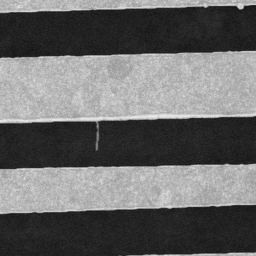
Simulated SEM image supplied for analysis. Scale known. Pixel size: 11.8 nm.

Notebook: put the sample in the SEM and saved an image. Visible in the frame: lines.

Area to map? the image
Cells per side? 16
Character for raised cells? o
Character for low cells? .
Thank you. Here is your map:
oooooooo........
................
................
.......ooooooooo
oooooooooooooooo
oooooooooooooooo
oooooooooooooooo
ooooo...........
................
................
.....ooooooooooo
oooooooooooooooo
oooooooooooooooo
................
................
................